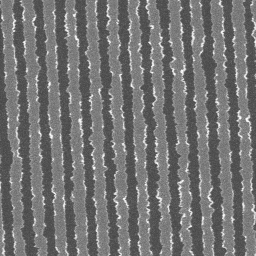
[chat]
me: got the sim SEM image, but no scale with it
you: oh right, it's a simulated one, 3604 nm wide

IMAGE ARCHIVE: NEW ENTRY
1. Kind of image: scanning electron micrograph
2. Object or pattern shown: parallel lines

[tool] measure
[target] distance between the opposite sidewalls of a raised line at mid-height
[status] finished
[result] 155 nanometers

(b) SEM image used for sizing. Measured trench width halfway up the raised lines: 9.99 pixels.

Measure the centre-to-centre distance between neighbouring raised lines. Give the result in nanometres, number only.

295